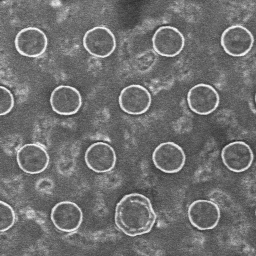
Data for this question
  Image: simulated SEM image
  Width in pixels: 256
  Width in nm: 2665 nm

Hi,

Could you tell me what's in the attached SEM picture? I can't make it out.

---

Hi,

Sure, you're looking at a regular array of raised bodies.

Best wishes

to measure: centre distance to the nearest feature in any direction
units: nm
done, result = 699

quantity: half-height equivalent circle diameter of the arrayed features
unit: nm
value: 306